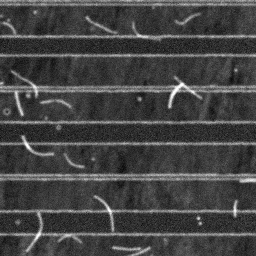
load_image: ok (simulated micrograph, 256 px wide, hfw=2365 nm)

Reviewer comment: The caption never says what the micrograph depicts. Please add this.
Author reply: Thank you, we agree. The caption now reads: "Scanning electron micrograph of lines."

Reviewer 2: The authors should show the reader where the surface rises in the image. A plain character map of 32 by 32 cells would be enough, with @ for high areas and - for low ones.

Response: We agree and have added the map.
@--@@@@@@@@@@@@@@@@@@@@@@@@@@@@@
--------------------------------
--------------------------------
--------------------------------
-----------------@--------------
@@@@@@@@@@@@@@@@@@@@@@@@@@@@@@@@
@@@@@@@@@@@@@@@@@@@@@@@@@@@@@@@@
--------------------------------
--------------------------------
--------------------------------
--------------------------------
--@@-----------------@----------
--------------------------------
--------------------------------
--------------------------------
@@@@@@@@@@@@@@@@@@@@@@@@@@@@@@@@
@@@@@@@@@@@@@@@@@@@@@@@@@@@@@@@@
@@@@@@@@@@@@@@@@@@@@@@@@@@@@@@@@
--------------------------------
--------------------------------
--------------------------------
--------------------------------
--------------------------------
--------------------------------
--------------------------------
--------------------------------
@@@@@@@@@@@@@@@@@@@@@@@@@@@@@@@@
@@@@@@@@@@@@@@@@@@@@@@@@@@@@@@@@
@@@@@@@@@@@@@@@@@@@@@@@@@@@@@@@@
--------------------------------
--------------------------------
--------------------------------